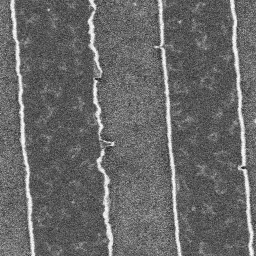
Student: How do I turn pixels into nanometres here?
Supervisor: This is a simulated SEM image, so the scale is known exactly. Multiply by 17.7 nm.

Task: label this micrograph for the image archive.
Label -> one or a few lines or trenches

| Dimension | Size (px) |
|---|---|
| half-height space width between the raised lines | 69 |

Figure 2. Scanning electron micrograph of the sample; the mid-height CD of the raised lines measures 1310 nanometres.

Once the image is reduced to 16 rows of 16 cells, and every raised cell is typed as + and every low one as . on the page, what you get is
.+++++....+++++.
.+++++....+++++.
.+++++....+++++.
.+++++....+++++.
.+++++....+++++.
.+++++....+++++.
.+++++.....++++.
.+++++.....++++.
.+++++.....++++.
..++++.....++++.
..++++.....++++.
..+++++....++++.
..+++++....++++.
..+++++....+++++
..+++++....+++++
..+++++....+++++